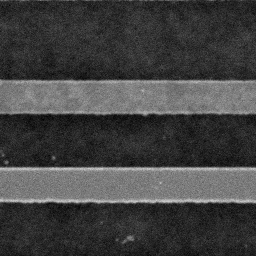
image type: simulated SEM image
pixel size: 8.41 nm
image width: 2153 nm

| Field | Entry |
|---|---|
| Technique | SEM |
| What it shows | lines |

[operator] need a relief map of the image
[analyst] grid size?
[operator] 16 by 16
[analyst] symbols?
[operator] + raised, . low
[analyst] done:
................
................
................
................
................
++++++++++++++++
++++++++++++++++
................
................
................
................
++++++++++++++++
++++++++++++++++
................
................
................